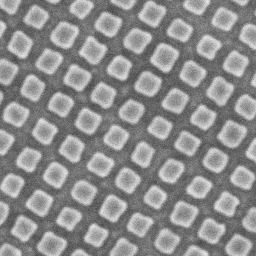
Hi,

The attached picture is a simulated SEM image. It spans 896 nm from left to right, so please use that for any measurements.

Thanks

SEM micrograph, a regular array of raised bodies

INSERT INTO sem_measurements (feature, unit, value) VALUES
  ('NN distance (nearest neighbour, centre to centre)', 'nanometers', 108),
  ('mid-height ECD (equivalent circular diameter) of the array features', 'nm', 80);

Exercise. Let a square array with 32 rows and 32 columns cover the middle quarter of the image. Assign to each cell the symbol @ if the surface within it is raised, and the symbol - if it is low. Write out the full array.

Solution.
--@--------@@@@@@------@@@@---@@
-@@@@------@@@@@--------@@----@@
-@@@@@@-----@@@@----@@-------@@@
@@@@@@@------@@@---@@@@@-----@@@
@@@@@@------------@@@@@@-------@
--@@@---@@@-------@@@@@@--------
---@----@@@@------@@@@@----@----
-------@@@@@@-------@@@---@@@@--
@@-----@@@@@-------------@@@@@@-
@@------@@@@----@@-------@@@@@@-
@@-------@@@---@@@@@-----@@@@@--
@----@--------@@@@@@------@@@@--
@---@@@@------@@@@@-------------
----@@@@@-----@@@@@----@@-------
---@@@@@@-------@@----@@@@------
---@@@@@----@@-------@@@@@@-----
----@@@@----@@@------@@@@@------
-----------@@@@@------@@@@---@@@
-@@-------@@@@@@--------@----@@@
@@@@------@@@@@-------------@@@@
@@@@@------@@@@---@@@-------@@@@
@@@@@-------------@@@@-------@@@
@@@@----@--------@@@@@---------@
-@@@---@@@@------@@@@@----------
------@@@@@@------@@@-----@@@---
------@@@@@@-------@@----@@@@@--
@-----@@@@@---@@@-------@@@@@@--
@--------@@---@@@@------@@@@@---
-------------@@@@@@-----@@@@----
---@@@-------@@@@@@-------@@----
---@@@@------@@@@@----@--------@
--@@@@@@-------@@----@@@-------@